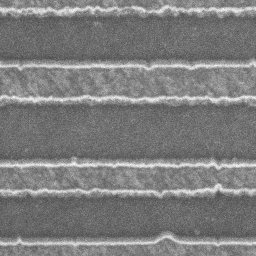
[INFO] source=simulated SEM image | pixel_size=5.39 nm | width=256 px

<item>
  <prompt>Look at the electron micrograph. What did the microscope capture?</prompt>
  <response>one or a few lines or trenches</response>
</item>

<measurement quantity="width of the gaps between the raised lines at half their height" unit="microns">0.302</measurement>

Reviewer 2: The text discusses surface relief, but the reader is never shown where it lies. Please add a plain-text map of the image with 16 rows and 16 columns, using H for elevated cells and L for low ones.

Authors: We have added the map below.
HHHHHHHHHHHHHHHH
LLLLLLLLLLLLLLLL
LLLLLLLLLLLLLLLL
LLLLLLLLLLLLLLLL
HHHHHHHHHHHHHHHH
HHHHHHHHHHHHHHHH
LLLLLLLLLLLLLLLL
LLLLLLLLLLLLLLLL
LLLLLLLLLLLLLLLL
LLLLLLLLLLLLLLLL
HHHHHHHHHHHHHHHH
HHHHHHHHHHHHHHHH
LLLLLLLLLLLLLLLL
LLLLLLLLLLLLLLLL
LLLLLLLLLLLLLLLL
HHHHHHHHHHHHHHHH